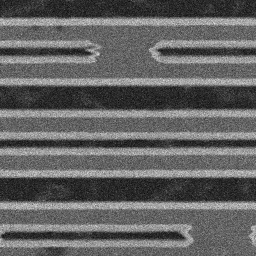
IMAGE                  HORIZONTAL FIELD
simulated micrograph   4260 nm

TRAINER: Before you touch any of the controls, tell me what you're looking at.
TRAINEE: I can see parallel lines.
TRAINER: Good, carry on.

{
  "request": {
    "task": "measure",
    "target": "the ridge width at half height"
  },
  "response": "376 nm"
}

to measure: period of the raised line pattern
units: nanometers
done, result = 752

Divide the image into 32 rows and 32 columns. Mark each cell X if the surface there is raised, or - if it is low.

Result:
--------------------------------
--------------------------------
--------------------------------
XXXXXXXXXXXXXXXXXXXXXXXXXXXXXXXX
XXXXXXXXXXXXXXXXXXXXXXXXXXXXXXXX
-------XXX-XXXXXXXXXXXX---------
------------XXXXXXX-------------
-----XXXXXXXXXXXXXXXXX----------
XXXXXXXXXXXXXXXXXXXXXXXXXXXXXXXX
XXXXXXXXXXXXXXXXXXXXXXXXXXXXXXXX
--------------------------------
--------------------------------
--------------------------------
--------------------------------
XXXXXXXXXXXXXXXXXXXXXXXXXXXXXXXX
XXXXXXXXXXXXXXXXXXXXXXXXXXXXXXXX
XXXXXXXXXXXXXXXXXXXXXXXXXXXXXXXX
--------------------------------
--------------------------------
XXXXXXXXXXXXXXXXXXXXXXXXXXXXXXXX
XXXXXXXXXXXXXXXXXXXXXXXXXXXXXXXX
XXXXXXXXXXXXXXXXXXXXXXXXXXXXXXXX
--------------------------------
--------------------------------
--------------------------------
--------------------------------
XXXXXXXXXXXXXXXXXXXXXXXXXXXXXXXX
XXXXXXXXXXXXXXXXXXXXXXXXXXXXXXXX
XXX----XXXX-XXXXXXXX--XXXXXXXXXX
-----------------------XXXXXXXXX
X----------------------XXXXXXXXX
XXXXXXXXXXXXXXXXXXXXXXXXXXXXXXXX